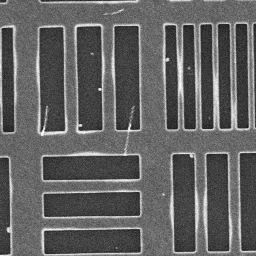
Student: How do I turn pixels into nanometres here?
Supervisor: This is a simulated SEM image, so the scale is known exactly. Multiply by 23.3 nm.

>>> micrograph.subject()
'groups of lines, slits or small figures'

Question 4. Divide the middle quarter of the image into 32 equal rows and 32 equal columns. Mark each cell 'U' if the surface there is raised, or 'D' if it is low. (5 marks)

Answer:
UUUDDDDDDDUUDDDDDDDUUUUUUDDDDDDD
UUUDDDDDDDUUDDDDDDDUUUUUUDDDDDDD
UUUDDDDDDDUUDDDDDDDUUUUUUDDDDDDD
UUUDDDDDDDUUUDDDDDDUUUUUUDDDDDDD
UUUDDDDDDDUUUDDDDDDUUUUUUDDDDDDD
UUUDDDDDDDUUUDDDDDDUUUUUUDDDDUDD
UUUDDDDDDDUUUDDDDDDUUUUUUDDDDUDD
UUUDDDDDDDUUUDDDDDDUUUUUUDDDDUDD
UUUDDDDDDDUUUDDDDDDUUUUUUDDDDUDD
UUUDDDDDDDUUUDDDDDDUUUUUUDDDDUDD
UUUUDDDDDDUUUDDDDDDUUUUUUDDDDUDD
UUUUDDDDDDUUUDDDDDDUUUUUUDDDDUDD
UUUUDDDDDDUUUDDDDDDUUUUUUDDDDUDD
UUUUDDDDDDUUUDDDDDDUUUUUUDDDDUDD
DUUUDDDDDDUUUDDDDDDUUUUUUDDDDUDD
DUUUDDDDDDUUUDDDDDDUUUUUUDDDDUDD
UUUUDDDDDDUUUDDDUDDUUUUUUUDDUUDD
UUUUUUUUUUUUUUUUUUUUUUUUUUUUUUUU
UUUUUUUUUUUUUUUUUUUUUUUUUUUUUUUU
UUUUUUUUUUUUUUUUUUUUUUUUUUUUUUUU
UUUUUUUUUUUUUUUUUUUUUUUUUUUUUUUU
UUUUUUUUUUUUUUUUUUUUUUUUUUUUUUUU
UUUUUUUUUUUUUUUUUUUUUUUUUUUUDDDD
DDDDDDDDDDDDDDDDDDDUUUUUUUUDDDDD
DDDDDDDDDDDDDDDDDDDUUUUUUUUDDDDD
DDDDDDDDDDDDDDDDDDDUUUUUUUUDDDDD
DDDDDDDDDDDDDDDDDDDUUUUUUUUDDDDD
DDDDDDDDDDDDDDDDDDDUUUUUUUUDDDDD
DDDDDDDDDDDDDDDDDDDUUUUUUUUDDDDD
UUUUUUUUUUUUUUUUUUUUUUUUUUUDDDDD
UUUUUUUUUUUUUUUUUUUUUUUUUUUDDDDD
UUUUUUUUUUUUUUUUUUUUUUUUUUUDDDDD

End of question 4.